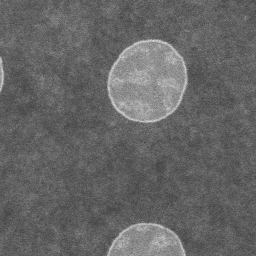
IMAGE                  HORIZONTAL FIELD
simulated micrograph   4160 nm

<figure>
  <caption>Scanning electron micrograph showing raised bodies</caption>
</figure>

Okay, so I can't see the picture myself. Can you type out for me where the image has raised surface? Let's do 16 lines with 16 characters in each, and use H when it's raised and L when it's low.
LLLLLLLLLLLLLLLL
LLLLLLLLLLLLLLLL
LLLLLLLLLLLLLLLL
LLLLLLLLHHHLLLLL
LLLLLLLHHHHHLLLL
LLLLLLLHHHHHLLLL
LLLLLLLHHHHLLLLL
LLLLLLLLHHLLLLLL
LLLLLLLLLLLLLLLL
LLLLLLLLLLLLLLLL
LLLLLLLLLLLLLLLL
LLLLLLLLLLLLLLLL
LLLLLLLLLLLLLLLL
LLLLLLLLLLLLLLLL
LLLLLLLLHHHLLLLL
LLLLLLLHHHHLLLLL